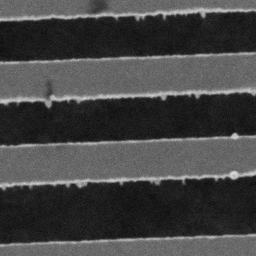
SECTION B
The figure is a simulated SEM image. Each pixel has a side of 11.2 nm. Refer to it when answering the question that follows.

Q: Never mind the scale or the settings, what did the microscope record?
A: lines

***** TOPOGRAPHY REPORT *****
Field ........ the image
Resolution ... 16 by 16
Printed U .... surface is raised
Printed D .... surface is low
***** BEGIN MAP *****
UUUUUUUUUUUUUUUU
DDDDDDDDDDDDDDDD
DDDDDDDDDDDDDDDD
DDDDDDDDDDUUUUUU
UUUUUUUUUUUUUUUU
UUUUUUUUUUUUUUUU
DDDDDDDDDDDDDDDD
DDDDDDDDDDDDDDDD
DDDDDDDDDDDDDDUD
UUUUUUUUUUUUUUUU
UUUUUUUUUUUUUUUU
UUUDDDDDDDDDDDDD
DDDDDDDDDDDDDDDD
DDDDDDDDDDDDDDDD
DDDDDDDDDDDDDDDD
UUUUUUUUUUUUUUUU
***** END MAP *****